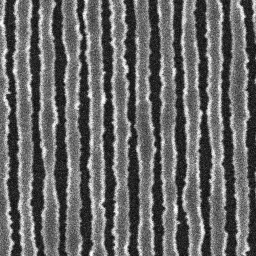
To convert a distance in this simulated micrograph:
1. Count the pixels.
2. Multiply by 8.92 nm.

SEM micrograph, parallel lines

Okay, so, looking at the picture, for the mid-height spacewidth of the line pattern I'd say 85.8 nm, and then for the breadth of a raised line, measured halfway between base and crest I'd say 126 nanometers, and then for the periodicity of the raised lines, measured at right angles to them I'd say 214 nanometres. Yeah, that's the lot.